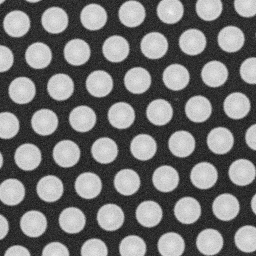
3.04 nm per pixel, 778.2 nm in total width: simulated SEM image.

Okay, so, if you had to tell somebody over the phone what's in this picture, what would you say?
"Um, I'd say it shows an array of small figures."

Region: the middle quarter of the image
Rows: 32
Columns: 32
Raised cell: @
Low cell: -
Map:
--------------------------@@@@--
----------------@@@@-----@@@@@@-
-------@@@@----@@@@@@----@@@@@@-
@@----@@@@@@---@@@@@@@---@@@@@@-
@@----@@@@@@---@@@@@@@---@@@@@@-
@@----@@@@@@---@@@@@@----@@@@@--
@@----@@@@@@----@@@@@------@@---
@@-----@@@@---------------------
@-------------------------------
----------------------@@@@-----@
----@@------@@@@@----@@@@@@---@@
--@@@@@----@@@@@@----@@@@@@---@@
-@@@@@@@---@@@@@@@---@@@@@@----@
-@@@@@@@---@@@@@@@---@@@@@@----@
-@@@@@@@---@@@@@@-----@@@@------
--@@@@@-----@@@@@---------------
---@@@--------------------------
---------------------------@@@@@
---------@@-------@@@@-----@@@@@
@@------@@@@@----@@@@@@---@@@@@@
@@@@---@@@@@@----@@@@@@---@@@@@@
@@@@---@@@@@@----@@@@@@---@@@@@@
@@@@---@@@@@@----@@@@@@----@@@@@
@@@@---@@@@@@-----@@@@----------
@@@-----@@@@--------------------
@@----------------------@@@-----
--------------@@@------@@@@@----
----@@@@-----@@@@@----@@@@@@----
---@@@@@@----@@@@@@---@@@@@@@---
---@@@@@@----@@@@@@---@@@@@@@---
---@@@@@@----@@@@@@----@@@@@----
---@@@@@@----@@@@@------@@@-----